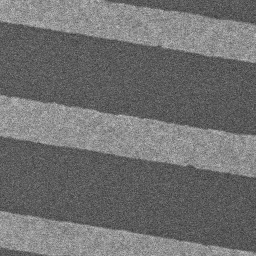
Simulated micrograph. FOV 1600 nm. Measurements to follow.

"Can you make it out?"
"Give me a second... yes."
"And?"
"one or a few lines or trenches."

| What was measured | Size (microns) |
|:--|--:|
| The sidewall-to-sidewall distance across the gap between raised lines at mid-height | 0.467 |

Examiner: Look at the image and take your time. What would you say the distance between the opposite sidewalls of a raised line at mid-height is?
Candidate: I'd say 238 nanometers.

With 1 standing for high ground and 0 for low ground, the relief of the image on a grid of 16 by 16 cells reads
1111111110000000
0111111111111110
0000000011111111
0000000000000011
0000000000000000
0000000000000000
1110000000000000
1111111110000000
1111111111111111
0000001111111111
0000000000000111
0000000000000000
0000000000000000
1100000000000000
1111111100000000
1111111111111100